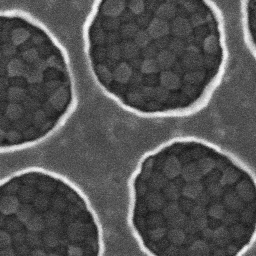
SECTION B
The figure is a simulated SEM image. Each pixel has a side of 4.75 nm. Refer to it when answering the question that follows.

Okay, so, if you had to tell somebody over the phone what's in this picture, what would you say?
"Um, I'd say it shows holes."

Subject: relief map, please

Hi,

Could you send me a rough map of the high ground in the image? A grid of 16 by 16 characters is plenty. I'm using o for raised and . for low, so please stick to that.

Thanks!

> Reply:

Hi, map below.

oooooo.......oo.
..oooo........o.
...ooo........oo
....oo........oo
....oo........oo
....ooo......ooo
....oooo....oooo
....oooooooooooo
...ooooooooooooo
oooooooooo....oo
ooooooooo......o
....oooo........
.....ooo........
......oo........
......ooo.......
......ooo......o